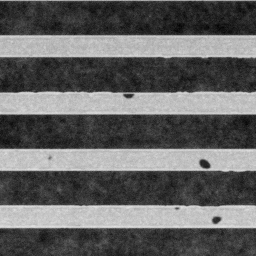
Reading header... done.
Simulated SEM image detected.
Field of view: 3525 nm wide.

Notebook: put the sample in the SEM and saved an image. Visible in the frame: lines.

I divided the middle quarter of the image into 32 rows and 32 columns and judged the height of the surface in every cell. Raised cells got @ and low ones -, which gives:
--------------------------------
--------------------------------
--------------------------------
--------------------------------
--------------------------------
--------------------------------
--------------------------------
@@@@@@@@@@@@@@@@@@@@@@@@@@@@@@@@
@@@@@@@@@@@@@@@@@@@@@@@@@@@@@@@@
@@@@@@@@@@@@@@@@@@@@@@@@@@@@@@@@
@@@@@@@@@@@@@@@@@@@@@@@@@@@@@@@@
@@@@@@@@@@@@@@@@@@@@@@@@@@@@@@@@
--------------------------------
--------------------------------
--------------------------------
--------------------------------
--------------------------------
--------------------------------
--------------------------------
--------------------------------
--------------------------------
@@@@@@@@@@@@@@@@@@@@@@@@@@@@@@@@
@@@@@@@@@@@@@@@@@@@@@@@@@@@@@@@@
@@@@@@@@@@@@@@@@@@@@@@@@@@@@@@@@
@@@@@@@@@@@@@@@@@@@@@@@@@@@@@@@@
@@@@@@@@@@@@@@@@@@@@@@@@@@@@@@@@
@@@@@@@@@@@@@@@@@@@@@@@@@@@@@@@@
--------------------------------
--------------------------------
--------------------------------
--------------------------------
--------------------------------